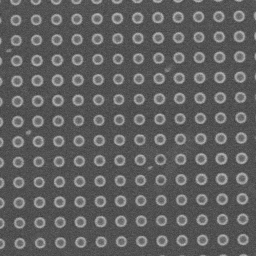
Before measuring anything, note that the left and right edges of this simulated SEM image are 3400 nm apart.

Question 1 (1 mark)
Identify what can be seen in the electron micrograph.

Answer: an array of small figures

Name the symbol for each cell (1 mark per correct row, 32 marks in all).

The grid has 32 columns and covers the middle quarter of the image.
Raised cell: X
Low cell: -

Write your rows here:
--------------------------------
--------------------------------
-----------------------X----XX--
--XXX--XXX--XXX---XX---XX---XX--
--XXX--XXX---XX---XX---XX---XX--
--------------------------------
--------------------------------
-----------------------X----XX--
--XXX--XXX---XX---XX---XX---XX--
--XXX--XXX---XX---XX---XX---XX--
--------------------------------
--------------------------------
--------------------------------
---XX---XX---XX---XX---XX---XX--
---XX---XX---XX---XX---XX---XX--
--------------------------------
--------------------------------
--------------------------------
---XX---XX---XX---XX---XX---XX--
---XX---XX---XX---XX---XX---XX--
--------------------------------
--------------------------------
--------------------------------
---XX---XX---XX---XX---XX---XX--
---XX---XX---XX---XX---XX---XX--
--------------------------------
--------------------------------
--------------------------------
---XX---XX---XX---XX---XX---XX--
---XX---XX---XX---XX---XX---XX--
---X----------------------------
--------------------------------